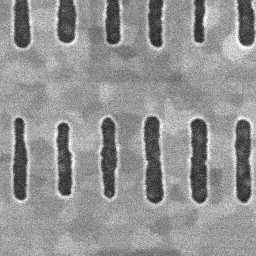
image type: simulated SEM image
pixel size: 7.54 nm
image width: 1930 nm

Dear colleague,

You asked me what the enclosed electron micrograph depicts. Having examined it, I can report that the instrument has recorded holes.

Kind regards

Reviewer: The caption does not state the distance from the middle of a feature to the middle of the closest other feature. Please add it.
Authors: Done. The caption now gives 44.3 px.